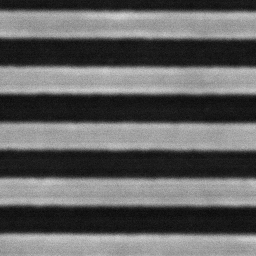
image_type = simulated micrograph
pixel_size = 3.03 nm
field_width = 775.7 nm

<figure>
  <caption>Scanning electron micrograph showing wiring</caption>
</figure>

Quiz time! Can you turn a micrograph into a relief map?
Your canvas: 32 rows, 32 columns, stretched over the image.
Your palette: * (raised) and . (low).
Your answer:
................................
************.*.**...*...........
********************************
********************************
********************************
................................
................................
................................
.*..............................
********************************
********************************
********************************
................................
................................
................................
**************.**...............
********************************
********************************
********************************
................................
................................
................................
********************************
********************************
********************************
....**.*************************
................................
................................
................................
********************************
********************************
********************************